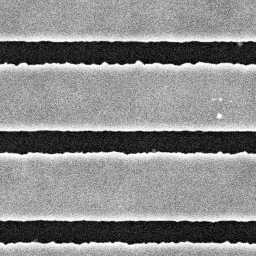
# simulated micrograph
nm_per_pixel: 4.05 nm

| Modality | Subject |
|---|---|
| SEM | lines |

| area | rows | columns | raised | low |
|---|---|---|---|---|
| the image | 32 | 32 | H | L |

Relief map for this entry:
HHHHHHHHHHHHHHHHHHHHHHHHHHHHHHHH
HHHHHHHHHHHHHHHHHHHHHHHHHHHHHHHH
HHHHHHHHHHHHHHHHHHHHHHHHHHHHHHHH
HHHHHHHHHHHHHHHHHHHHHHHHHHHHHHHH
HHHHHHHHHHHHHHHHHHHHHHHHHHHHHHHH
LLLLLLLLLLLLLLLLLLLLLLLLLLLLLLLL
LLLLLLLLLLLLLLLLLLLLLLLLLLLLLLLL
LLLLLLLLLLLLLLLLLLLLLLLLLLLLLLLL
HHHHHHHHHHHHHHHHHHHHHHHHHHHHHHHH
HHHHHHHHHHHHHHHHHHHHHHHHHHHHHHHH
HHHHHHHHHHHHHHHHHHHHHHHHHHHHHHHH
HHHHHHHHHHHHHHHHHHHHHHHHHHHHHHHH
HHHHHHHHHHHHHHHHHHHHHHHHHHHHHHHH
HHHHHHHHHHHHHHHHHHHHHHHHHHHHHHHH
HHHHHHHHHHHHHHHHHHHHHHHHHHHHHHHH
HHHHHHHHHHHHHHHHHHHHHHHHHHHHHHHH
LLLLLLLLLLLLLLLLLLLLLLLLLLLLLLLL
LLLLLLLLLLLLLLLLLLLLLLLLLLLLLLLL
LLLLLLLLLLLLLLLLLLLLLLLLLLLLLLLL
HHHHHHHHHHHHHHHHHHHHHHHHHHHHHHHH
HHHHHHHHHHHHHHHHHHHHHHHHHHHHHHHH
HHHHHHHHHHHHHHHHHHHHHHHHHHHHHHHH
HHHHHHHHHHHHHHHHHHHHHHHHHHHHHHHH
HHHHHHHHHHHHHHHHHHHHHHHHHHHHHHHH
HHHHHHHHHHHHHHHHHHHHHHHHHHHHHHHH
HHHHHHHHHHHHHHHHHHHHHHHHHHHHHHHH
HHHHHHHHHHHHHHHHHHHHHHHHHHHHHHHH
HHHHHHHHHHHHHHHHHHHHHHHHHHHHHHHH
LLLLLLLLLLLLLLLLLLLLLLLLLLLLLLLL
LLLLLLLLLLLLLLLLLLLLLLLLLLLLLLLL
LLHHHLHLHLHHHHHHLHHHHHHHHHHHHHHL
HHHHHHHHHHHHHHHHHHHHHHHHHHHHHHHH